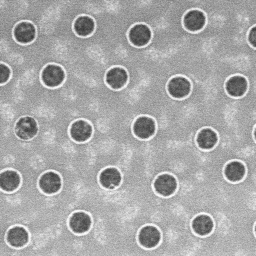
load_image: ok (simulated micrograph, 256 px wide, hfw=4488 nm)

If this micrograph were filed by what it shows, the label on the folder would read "a regular array of raised bodies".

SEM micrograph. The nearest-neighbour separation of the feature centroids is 932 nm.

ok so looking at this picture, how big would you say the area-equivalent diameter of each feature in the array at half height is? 421 nanometres